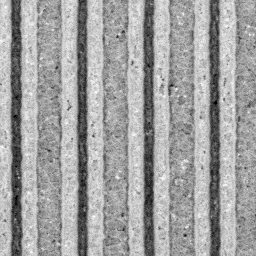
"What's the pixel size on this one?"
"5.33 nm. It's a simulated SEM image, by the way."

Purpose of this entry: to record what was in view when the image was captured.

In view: parallel lines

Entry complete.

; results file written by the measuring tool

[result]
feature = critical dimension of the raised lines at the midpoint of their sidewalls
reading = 75.9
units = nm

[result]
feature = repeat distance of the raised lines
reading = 0.177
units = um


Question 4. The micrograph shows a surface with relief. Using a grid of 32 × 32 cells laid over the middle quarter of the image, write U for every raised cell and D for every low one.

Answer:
UUUDDDUUUUDDDDDDUUUUDDDUUUDDDDDD
UUUDDDUUUUDDDDDDUUUUDDDUUUDDDDDD
UUUDDDUUUDDDDDDDUUUUDDDUUUDDDDDD
UUUDDDUUUDDDDDDDUUUUDDDUUUDDDDDD
UUUDDDUUUUDDDDDDUUUUDDDUUUDDDDDD
UUUDDDUUUUDDDDDDUUUUDDDUUUDDDDDD
UUUDDDUUUUDDDDDDUUUUDDUUUUDDDDDD
UUUDDDUUUUDDDDDDUUUUDDDUUUDDDDDD
UUUDDDUUUUDDDDDDUUUUDDDUUUDDDDDD
UUUDDDUUUUDDDDDDUUUUDDDUUUDDDDDD
UUUDDDUUUUDDDDDDUUUUDDDUUUDDDDDD
UUUDDDUUUUDDDDDDUUUUDDDUUUDDDDDD
UUUDDDUUUUDDDDDDUUUUDDDUUUDDDDDD
UUUDDDUUUUDDDDDDUUUUDDDUUUDDDDDD
UUUDDDUUUDDDDDDDUUUUDDDUUUDDDDDD
UUUDDDUUUUDDDDDDUUUUDDDUUUDDDDDD
UUUDDDUUUDDDDDDDUUUUDDDUUUDDDDDD
UUUDDDUUUDDDDDDDUUUUDDDUUUDDDDDD
UUUDDDUUUUDDDDDDUUUUDDDUUUDDDDDD
UUUDDDUUUUDDDDDDUUUUDDDUUUDDDDDD
UUUDDDUUUUDDDDDDUUUUDDDUUUDDDDDD
UUUDDDUUUUDDDDDDUUUUDDDUUUDDDDDD
UUUDDDUUUUDDDDDDUUUUDDDUUUDDDDDD
UUUDDDUUUUDDDDDDUUUUDDDUUUDDDDDD
UUUDDDUUUUDDDDDDUUUUDDDUUUDDDDDD
UUUDDDUUUUDDDDDDUUUUDDDUUUDDDDDD
UUUDDDUUUUDDDDDDUUUUDDDUUUDDDDDD
UUUDDDUUUDDDDDDDUUUUDDDUUUDDDDDD
UUUDDDUUUUDDDDDDUUUUDDDUUUDDDDDD
UUUDDDUUUUDDDDDDUUUUDDDUUUDDDDDD
UUUUDDUUUUDDDDDDUUUUDDUUUUDDDDDD
UUUDDDUUUUDDDDDDUUUUDDUUUUDDDDDD